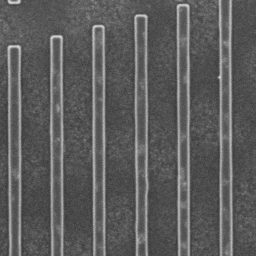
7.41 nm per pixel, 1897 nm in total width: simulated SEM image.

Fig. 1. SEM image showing parallel lines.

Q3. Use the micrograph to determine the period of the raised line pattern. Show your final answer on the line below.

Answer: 0.313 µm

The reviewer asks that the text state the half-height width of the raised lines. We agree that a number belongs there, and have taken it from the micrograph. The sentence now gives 76.9 nm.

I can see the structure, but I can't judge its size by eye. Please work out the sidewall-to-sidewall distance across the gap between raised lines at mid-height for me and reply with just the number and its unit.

0.235 µm